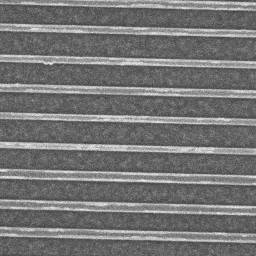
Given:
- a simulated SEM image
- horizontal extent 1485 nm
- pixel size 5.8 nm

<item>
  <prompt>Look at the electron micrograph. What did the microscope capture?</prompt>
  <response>parallel lines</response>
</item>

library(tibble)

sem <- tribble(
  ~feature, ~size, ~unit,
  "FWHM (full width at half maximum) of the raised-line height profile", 0.0391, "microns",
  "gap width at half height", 128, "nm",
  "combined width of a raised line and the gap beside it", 169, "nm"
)